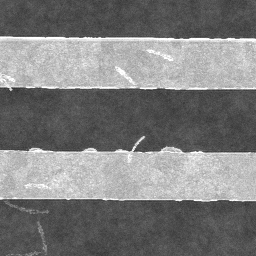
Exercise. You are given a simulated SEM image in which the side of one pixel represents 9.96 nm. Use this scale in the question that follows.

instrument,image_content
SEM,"lines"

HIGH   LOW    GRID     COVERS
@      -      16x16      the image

----------------
----------------
@@@@@@@@@@@@@@@@
@@@@@@@@@@@@@@@@
@@@@@@@@@@@@@@@@
--------@@@@@@@@
----------------
----------------
----------------
@@@@----@-------
@@@@@@@@@@@@@@@@
@@@@@@@@@@@@@@@@
-----------@@@@@
----------------
----------------
----------------